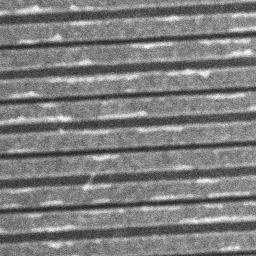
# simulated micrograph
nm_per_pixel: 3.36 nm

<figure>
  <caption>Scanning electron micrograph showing parallel lines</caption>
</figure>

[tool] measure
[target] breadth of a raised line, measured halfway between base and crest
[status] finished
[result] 0.0621 µm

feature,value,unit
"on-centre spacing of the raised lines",0.0911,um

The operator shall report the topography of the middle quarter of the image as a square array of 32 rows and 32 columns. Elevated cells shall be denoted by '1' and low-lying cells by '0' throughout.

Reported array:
00000000000000000000000000000000
00000000000000000000000000000000
00000000000000000000111111111111
00111111111111111111111111111111
11111111111111111111111111111111
11111111111111111111111111111111
11111111111111111111111110000000
11111100000000000000000000000000
00000000000000000000000111111111
00000111111111111111111111111111
11111111111111111111111111111111
11111111111111111111111111111111
11111111111111111111111111111000
11111111111100000000000000000000
00000000000000000000000000000000
00000000000000000000000000000001
00000000000011111111111111111111
11111111111111111111111111111111
11111111111111111111111111111111
11111111111111111111111111111111
11111111111111110110000000000000
10000000000000000000000000000000
00000000000000011111111111111111
11111111111111111111111111111111
11111111111111111111111111111111
11111111111111111111111111111111
11111111111111111111111000000000
11100001000000000000000000000000
00000000000000000000000000000000
00000000000000000000000111111111
00001111111111111111111111111111
11111111111111111111111111111111